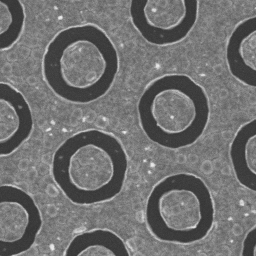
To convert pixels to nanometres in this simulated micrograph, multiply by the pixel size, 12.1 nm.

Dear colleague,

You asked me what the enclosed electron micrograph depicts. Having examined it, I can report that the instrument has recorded ring-shaped grooves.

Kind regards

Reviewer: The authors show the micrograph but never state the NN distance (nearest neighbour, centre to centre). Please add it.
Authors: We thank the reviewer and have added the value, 1200 nm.